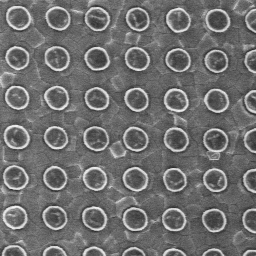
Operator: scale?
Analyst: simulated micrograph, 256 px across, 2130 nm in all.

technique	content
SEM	a regular array of raised bodies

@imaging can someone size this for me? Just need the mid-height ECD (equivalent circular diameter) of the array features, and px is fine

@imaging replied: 22.6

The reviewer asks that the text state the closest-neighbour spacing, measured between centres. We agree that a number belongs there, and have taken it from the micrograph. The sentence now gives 39.4 pixels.